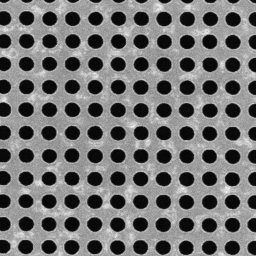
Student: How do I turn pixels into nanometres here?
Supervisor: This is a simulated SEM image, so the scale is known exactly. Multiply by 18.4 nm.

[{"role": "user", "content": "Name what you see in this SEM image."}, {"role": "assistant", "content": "a regular array of holes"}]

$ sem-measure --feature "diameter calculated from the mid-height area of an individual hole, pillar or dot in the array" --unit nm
277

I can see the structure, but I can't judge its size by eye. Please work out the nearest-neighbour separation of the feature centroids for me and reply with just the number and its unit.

0.416 micrometres